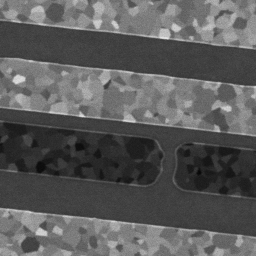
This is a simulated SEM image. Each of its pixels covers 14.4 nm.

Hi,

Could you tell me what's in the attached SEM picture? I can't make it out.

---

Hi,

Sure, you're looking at one or a few lines or trenches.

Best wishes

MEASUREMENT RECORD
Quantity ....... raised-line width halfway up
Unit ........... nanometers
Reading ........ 706